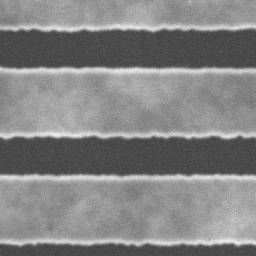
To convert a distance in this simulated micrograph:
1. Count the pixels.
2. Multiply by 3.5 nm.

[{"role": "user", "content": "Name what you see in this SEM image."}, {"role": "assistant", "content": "lines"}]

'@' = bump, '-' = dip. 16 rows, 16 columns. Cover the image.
@@@@@@@@@@@@@@@@
@@@@@@@@@@@@@@@@
----------------
----------------
@@@@@@@@@@@@@@@@
@@@@@@@@@@@@@@@@
@@@@@@@@@@@@@@@@
@@@@@@@@@@@@@@@@
@@@@@-@@@@@@@@@@
----------------
----------------
@@@@@@@@@@@@@@@@
@@@@@@@@@@@@@@@@
@@@@@@@@@@@@@@@@
@@@@@@@@@@@@@@@@
----------------